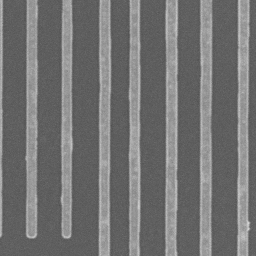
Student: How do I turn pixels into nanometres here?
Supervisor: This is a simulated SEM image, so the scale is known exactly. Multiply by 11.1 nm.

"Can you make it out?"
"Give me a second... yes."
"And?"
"parallel lines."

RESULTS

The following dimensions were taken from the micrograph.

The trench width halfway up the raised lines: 293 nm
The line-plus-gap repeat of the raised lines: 389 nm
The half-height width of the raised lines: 0.108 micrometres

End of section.